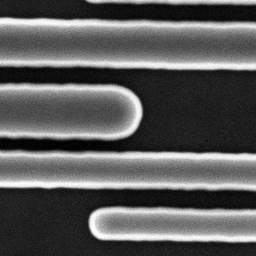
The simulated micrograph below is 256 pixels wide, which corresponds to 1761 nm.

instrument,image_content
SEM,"groups of lines, slits or small figures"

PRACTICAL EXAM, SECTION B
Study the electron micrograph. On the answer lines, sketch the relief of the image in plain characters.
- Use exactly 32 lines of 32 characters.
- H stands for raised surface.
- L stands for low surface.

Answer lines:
LLLLLLLLLLLLLLLLLLLLLLLLLLLLLLLL
LLLLLLLLLLLLLLLLLLLLLLLLLLLLLLLL
LLLLLLLLLLLLLLLLLLLLLLLLLLLLLLLL
HHHHHHHHHHHHHHHHHHHHHHHHHHHHHHHH
HHHHHHHHHHHHHHHHHHHHHHHHHHHHHHHH
HHHHHHHHHHHHHHHHHHHHHHHHHHHHHHHH
HHHHHHHHHHHHHHHHHHHHHHHHHHHHHHHH
HHHHHHHHHHHHHHHHHHHHHHHHHHHHHHHH
LLLLLLLLLLLLLLLLLLLLLLLLLLLLLLLL
LLLLLLLLLLLLLLLLLLLLLLLLLLLLLLLL
LLLLLLLLLLLLLLLLLLLLLLLLLLLLLLLL
HHHHHHHHHHHHHHHHLLLLLLLLLLLLLLLL
HHHHHHHHHHHHHHHHHLLLLLLLLLLLLLLL
HHHHHHHHHHHHHHHHHLLLLLLLLLLLLLLL
HHHHHHHHHHHHHHHHHLLLLLLLLLLLLLLL
HHHHHHHHHHHHHHHHHLLLLLLLLLLLLLLL
HHHHHHHHHHHHHHHHLLLLLLLLLLLLLLLL
LLLLLLLLLLLLLLLLLLLLLLLLLLLLLLLL
LLLLLLLLLLLLLLLLLLLLLLLLLLLLLLLL
HHHHHHHHHHHHHHHHHHHHHHHHHHHHLLLL
HHHHHHHHHHHHHHHHHHHHHHHHHHHHHHHH
HHHHHHHHHHHHHHHHHHHHHHHHHHHHHHHH
HHHHHHHHHHHHHHHHHHHHHHHHHHHHHHHH
LLLLLLLLLLLLLLLLLLLLLLLLLLLLLLLH
LLLLLLLLLLLLLLLLLLLLLLLLLLLLLLLL
LLLLLLLLLLLLLLLLLLLLLLLLLLLLLLLL
LLLLLLLLLLLLHHHHHHHHHHHHHHHHLHHH
LLLLLLLLLLLLHHHHHHHHHHHHHHHHHHHH
LLLLLLLLLLLLHHHHHHHHHHHHHHHHHHHH
LLLLLLLLLLLLHHHHHHHHHHHHHHHHHHHH
LLLLLLLLLLLLLLLLLLLLLLLLLLLLLLLL
LLLLLLLLLLLLLLLLLLLLLLLLLLLLLLLL